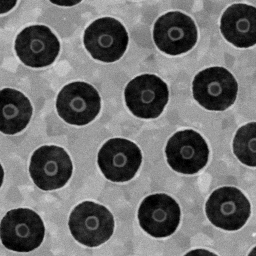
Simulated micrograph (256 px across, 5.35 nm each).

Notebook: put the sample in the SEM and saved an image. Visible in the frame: a regular array of ring-shaped grooves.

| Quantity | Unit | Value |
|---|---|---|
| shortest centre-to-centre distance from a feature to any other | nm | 365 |